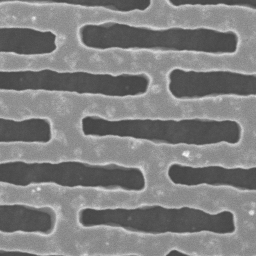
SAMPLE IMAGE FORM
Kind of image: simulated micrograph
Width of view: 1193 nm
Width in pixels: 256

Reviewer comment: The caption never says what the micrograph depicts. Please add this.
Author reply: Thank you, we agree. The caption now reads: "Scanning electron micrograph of holes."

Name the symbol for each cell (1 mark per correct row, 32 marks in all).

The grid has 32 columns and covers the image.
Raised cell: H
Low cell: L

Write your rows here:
HHHHHHHHHLLLLLLLLLLHHHLLLLLLLLLL
HHHHHHHHHHHHHHHHHHHHHHHHHHHHHHHH
HHHHHHHHHHHHHHHHHHHHHHHHHHHHHHHH
LLLHHHHHHHLLLLLLLLHHHHHHHHHHHHHH
LLLLLLLHHHLLLLLLLLLLLLLLLLLLLLHH
LLLLLLLHHHHLLLLLLLLLLLLLLLLLLLHH
LLLLLLHHHHHHHHHHHHHHHHHHHHLHLHHH
HHHHHHHHHHHHHHHHHHHHHHHHHHHHHHHH
HHHHHHHHHHHHHHHHHHHHHHHHHHHHHHHH
LLLLLLLLLLLLLLLLLLHHHLLLLLLLLLLL
LLLLLLLLLLLLLLLLLLHHHLLLLLLLLLLL
HHHHHHHHHLLLLLLLLLHHHLLLLLLLLLLL
HHHHHHHHHHHHHHHHHHHHHHHHHHHHHHHH
HHHHHHHHHHHHHHHHHHHHHHHHHHHHHHHH
HHHHHHHHHHHHHHHHHHHHHHHHHHHHHHHH
LLLLLLHHHHLLLLLLLLLLLLLLLLLLLLHH
LLLLLLHHHHLLLLLLLLLLLLLLLLLLLLHH
LLLLLLHHHHHHHHHHHHHLLLLLLLLLLLHH
HHHHHHHHHHHHHHHHHHHHHHHHHHHHHHHH
HHHHHHHHHHHHHHHHHHHHHHHHHHHHHHHH
LLLLLLLLLLLHHHHHHHHHHHHHHHHHHHHH
LLLLLLLLLLLLLLLLLLHHHLLLLLLLLLLL
LLLLLLLLLLLLLLLLLLHHHLLLLLLLLLLL
HHHHHHHHHHHHHLHLLLHHHHHHHHHHHHLL
HHHHHHHHHHHHHHHHHHHHHHHHHHHHHHHH
HHHHHHHHHHHHHHHHHHHHHHHHHHHHHHHH
LLLLLLLHHHLLLLLLLLLLLLLLLLHHLHHH
LLLLLLLHHHLLLLLLLLLLLLLLLLLLLHHH
LLLLLLLHHHHHHHHLLLLLLLLLLLLLLHHH
HHHHHHHHHHHHHHHHHHHHHHHHHHHHHHHH
HHHHHHHHHHHHHHHHHHHHHHHHHHHHHHHH
LLLHHHHHHHHHHHHHHHHHHLHHHHHHHHHH